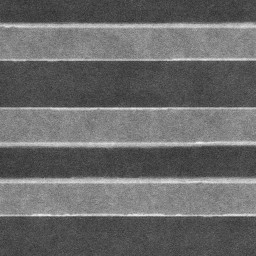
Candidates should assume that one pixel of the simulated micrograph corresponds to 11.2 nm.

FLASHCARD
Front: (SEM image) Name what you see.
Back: lines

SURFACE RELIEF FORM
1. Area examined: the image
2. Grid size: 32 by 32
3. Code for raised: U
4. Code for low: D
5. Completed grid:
DDDDDDDDDDDDDDDDDDDDDDDDDDDDDDDD
DDDDDDDDDDDDDDDDDDDDDDDDDDDDDDDD
DDDDDDDDDDDDDDDDDDDDDDDDDDDDDDDD
UUUUUUUUUUUUUUUUUUUUUUUUUUUUUUUU
UUUUUUUUUUUUUUUUUUUUUUUUUUUUUUUU
UUUUUUUUUUUUUUUUUUUUUUUUUUUUUUUU
UUUUUUUUUUUUUUUUUUUUUUUUUUUUUUUU
DDDDDDDDDDDDDDDDDDDDDDDDDDDDDDDD
DDDDDDDDDDDDDDDDDDDDDDDDDDDDDDDD
DDDDDDDDDDDDDDDDDDDDDDDDDDDDDDDD
DDDDDDDDDDDDDDDDDDDDDDDDDDDDDDDD
DDDDDDDDDDDDDDDDDDDDDDDDDDDDDDDD
DDDDDDDDDDDDDDDDDDDDDDDDDDDDDDDD
DDDDDDDDDDDDDDDDDDDDDDDDDDDDDDDD
UUUUUUUUUUUUUUUUUUUUUUUUUUUUUUUU
UUUUUUUUUUUUUUUUUUUUUUUUUUUUUUUU
UUUUUUUUUUUUUUUUUUUUUUUUUUUUUUUU
UUUUUUUUUUUUUUUUUUUUUUUUUUUUUUUU
DDDDDDDDDDDDDDDDDDDDDDDDDDDDDDDD
DDDDDDDDDDDDDDDDDDDDDDDDDDDDDDDD
DDDDDDDDDDDDDDDDDDDDDDDDDDDDDDDD
DDDDDDDDDDDDDDDDDDDDDDDDDDDDDDDD
DDDDDDDDDDDDDDDDDDDDDDDDDDDDDDDD
UUUUUUUUUUUUUUUUUUUUUUUUUUUUUUUU
UUUUUUUUUUUUUUUUUUUUUUUUUUUUUUUU
UUUUUUUUUUUUUUUUUUUUUUUUUUUUUUUU
UUUUUUUUUUUUUUUUUUUUUUUUUUUUUUUU
DDDDDDDDDDDDDDDDDDDDDDDDDDDDDDDD
DDDDDDDDDDDDDDDDDDDDDDDDDDDDDDDD
DDDDDDDDDDDDDDDDDDDDDDDDDDDDDDDD
DDDDDDDDDDDDDDDDDDDDDDDDDDDDDDDD
DDDDDDDDDDDDDDDDDDDDDDDDDDDDDDDD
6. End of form